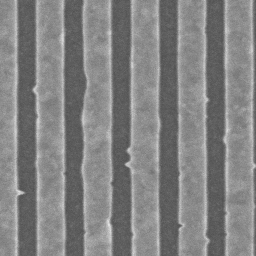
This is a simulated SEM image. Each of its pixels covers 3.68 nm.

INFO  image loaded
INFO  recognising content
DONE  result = parallel lines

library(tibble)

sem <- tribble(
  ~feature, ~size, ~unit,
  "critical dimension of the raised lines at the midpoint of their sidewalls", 26.2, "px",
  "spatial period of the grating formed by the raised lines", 174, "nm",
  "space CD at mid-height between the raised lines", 74.9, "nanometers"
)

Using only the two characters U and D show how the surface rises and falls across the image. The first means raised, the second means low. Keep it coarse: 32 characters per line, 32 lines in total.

UUDDDUUUDDDUUUDDDUUUDDUUUUDDUUUD
UUDDDUUUDDUUUUDDDUUUDDUUUUDDUUUD
UUDDDUUUDDUUUUDDDUUUDDUUUUDDUUUD
UUDDDUUUDDUUUUDDDUUUDDUUUUDDUUUD
UUDDDUUUDDUUUUDDDUUUDDUUUUDDUUUD
UUDDDUUUDDUUUUDDDUUUDDUUUUDDUUUD
UUDDDUUUDDDUUUDDDUUUDDUUUUDDUUUD
UUDDDUUUDDDUUUDDDUUUDDUUUUDDUUUD
UUDDDUUUDDDUUUDDDUUUDDUUUUDDUUUD
UUDDDUUUDDDUUUDDDUUUDDUUUUDDUUUD
UUDDDUUUDDDUUUDDDUUUDDUUUUDDUUUD
UUDDUUUUDDDUUUDDUUUUDDUUUUDDUUUD
UUDDDUUUDDDUUUDDUUUUDDUUUUDDUUUD
UUDDDUUUDDDUUUDDDUUUDDUUUUDDUUUD
UUDDDUUUDDUUUUDDDUUUDDUUUUDDUUUD
UUDDDUUUDDUUUUDDDUUUDDUUUUDDUUUD
UUDDDUUUDDDUUUDDUUUUDDUUUUDDUUUD
UUDDDUUUDDDUUUDDUUUUDDUUUUDDUUUD
UUDDDUUUDDDUUUDDUUUUDDUUUUDDUUUD
UUDDDUUUDDDUUUDDUUUUDDUUUUDDUUUU
UUDDDUUUDDUUUUDDUUUUDDUUUUDDUUUU
UUDDDUUUDDUUUUDDUUUUDDDUUUDDUUUU
UUDDDUUUDDUUUUDDDUUUDDDUUUDDUUUU
UUDDDUUUDDDUUUDDDUUUDDDUUUDDUUUU
UUDDDUUUDDDUUUDDDUUUDDDUUUDDUUUU
UUDDDUUUDDDUUUDDDUUUDDDUUUDDUUUU
UUDDDUUUDDDUUUDDDUUUDDUUUUDDUUUU
UUDDDUUUDDDUUUDDDUUUDDUUUUDDUUUU
UUDDDUUUDDDUUUDDDUUUDDDUUUDDUUUU
UUDDDUUUDDDUUUDDDUUUDDUUUUDDUUUU
UUDDDUUUDDDUUUDDDUUUDDUUUUDDUUUU
UUDDDUUUDDDUUUDDDUUUDDUUUUDDUUUU